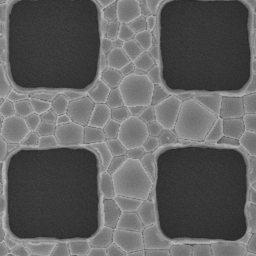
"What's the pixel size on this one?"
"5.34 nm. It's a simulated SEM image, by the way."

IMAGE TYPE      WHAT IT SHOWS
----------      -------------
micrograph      holes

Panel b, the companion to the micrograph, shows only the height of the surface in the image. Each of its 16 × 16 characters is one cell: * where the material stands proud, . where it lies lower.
*.....****.....*
......****......
......****......
......****......
*.....****......
*....******....*
****************
****************
****************
*.....****.....*
......****.....*
......****.....*
......****.....*
......****.....*
*.....****.....*
****************